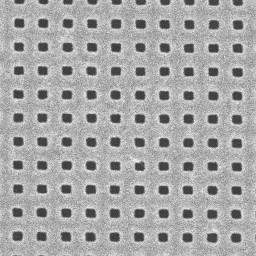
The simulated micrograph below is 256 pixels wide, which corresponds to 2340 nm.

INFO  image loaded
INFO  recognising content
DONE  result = a regular array of holes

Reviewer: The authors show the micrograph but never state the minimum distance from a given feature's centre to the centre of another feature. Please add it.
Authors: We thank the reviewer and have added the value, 216 nm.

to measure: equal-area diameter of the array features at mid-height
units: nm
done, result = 98.9